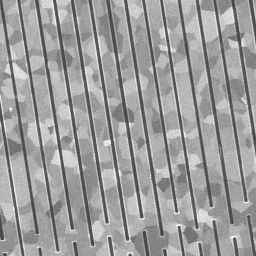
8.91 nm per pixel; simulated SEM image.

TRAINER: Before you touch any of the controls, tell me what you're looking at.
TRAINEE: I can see parallel lines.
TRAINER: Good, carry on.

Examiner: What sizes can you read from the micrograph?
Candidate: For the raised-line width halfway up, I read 124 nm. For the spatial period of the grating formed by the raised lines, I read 157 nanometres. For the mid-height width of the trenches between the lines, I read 38.5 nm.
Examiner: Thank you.